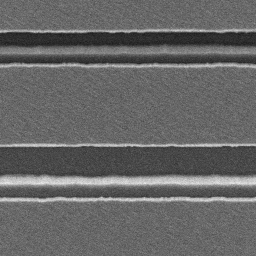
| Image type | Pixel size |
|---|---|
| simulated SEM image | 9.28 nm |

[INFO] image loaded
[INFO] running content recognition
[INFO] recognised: lines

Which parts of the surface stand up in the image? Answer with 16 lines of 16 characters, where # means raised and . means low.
################
################
................
................
################
################
################
################
################
................
................
................
################
################
################
################